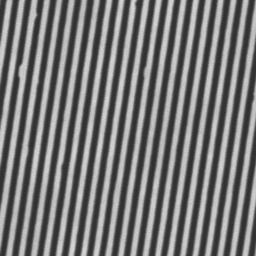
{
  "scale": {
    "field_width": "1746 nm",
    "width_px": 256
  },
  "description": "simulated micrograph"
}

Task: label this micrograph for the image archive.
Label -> parallel lines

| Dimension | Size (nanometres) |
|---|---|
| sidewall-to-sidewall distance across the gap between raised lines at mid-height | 44.8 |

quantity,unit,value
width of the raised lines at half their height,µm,0.0379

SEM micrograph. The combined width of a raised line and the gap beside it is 83.9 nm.